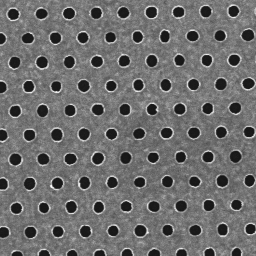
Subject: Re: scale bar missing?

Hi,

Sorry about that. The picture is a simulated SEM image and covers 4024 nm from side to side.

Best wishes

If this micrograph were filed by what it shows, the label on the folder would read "a regular array of holes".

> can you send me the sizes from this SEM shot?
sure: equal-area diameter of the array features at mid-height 11.2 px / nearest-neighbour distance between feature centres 429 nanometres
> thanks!